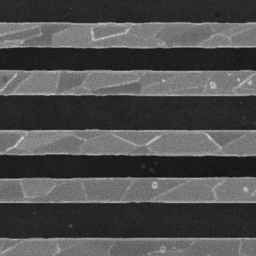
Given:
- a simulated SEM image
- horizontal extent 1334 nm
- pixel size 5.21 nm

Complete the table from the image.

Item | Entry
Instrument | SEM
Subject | lines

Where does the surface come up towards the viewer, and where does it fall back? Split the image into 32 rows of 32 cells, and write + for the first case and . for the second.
................................
................................
................................
++++++++++++++++++++++++++++++++
++++++++++++++++++++++++++++++++
++++++++++++++++++++++++++++++++
................................
................................
................................
++++++++++++++++++++++++++++++++
++++++++++++++++++++++++++++++++
++++++++++++++++++++++++++++++++
................................
................................
................................
................................
++++++++++++++++++++++++++++++++
++++++++++++++++++++++++++++++++
++++++++++++++++++++++++++++++++
................................
................................
................................
++++++++++++++++++++++++++++++++
++++++++++++++++++++++++++++++++
++++++++++++++++++++++++++++++++
................................
................................
................................
................................
................................
++++++++++++++++++++++++++++++++
++++++++++++++++++++++++++++++++